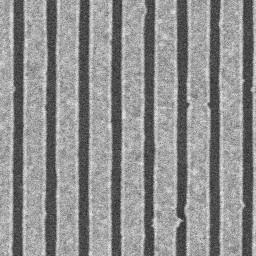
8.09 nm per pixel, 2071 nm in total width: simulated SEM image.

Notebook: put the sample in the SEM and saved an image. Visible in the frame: parallel lines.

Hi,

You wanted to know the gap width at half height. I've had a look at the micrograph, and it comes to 101 nanometers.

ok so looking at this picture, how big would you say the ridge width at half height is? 165 nanometers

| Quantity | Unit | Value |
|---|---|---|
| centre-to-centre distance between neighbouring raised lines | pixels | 32.8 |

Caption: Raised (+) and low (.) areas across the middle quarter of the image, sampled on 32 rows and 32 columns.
+++....++++....+++++...+++++...+
+++....++++....+++++...+++++...+
+++....++++....+++++...+++++...+
+++....++++....+++++...+++++...+
+++....++++....+++++...+++++...+
+++....++++....+++++...+++++...+
+++....++++....+++++...+++++...+
+++....++++....+++++...+++++...+
+++....++++....+++++...+++++...+
+++....++++....+++++...+++++...+
+++....++++....+++++...+++++....
+++....++++....+++++...+++++...+
+++....++++....+++++...+++++...+
+++....++++....++++....+++++...+
+++....++++....++++....+++++...+
+++....++++....++++....+++++...+
+++....++++....++++....+++++...+
+++....+++++...+++++...+++++...+
+++....+++++...+++++...+++++...+
+++....+++++...+++++...+++++...+
+++....+++++...++++....+++++...+
+++....+++++...++++....+++++...+
+++....+++++...++++....+++++...+
+++....+++++...+++++...+++++...+
+++....+++++...+++++...+++++...+
+++....++++....+++++...+++++...+
+++....++++....+++++...+++++...+
+++....++++....+++++...+++++...+
+++....++++....+++++...+++++...+
+++....++++....+++++...+++++...+
+++....++++....+++++...+++++...+
+++....++++....+++++...+++++...+